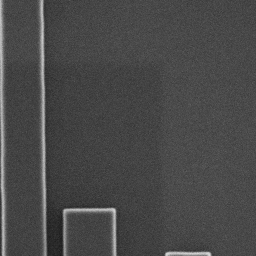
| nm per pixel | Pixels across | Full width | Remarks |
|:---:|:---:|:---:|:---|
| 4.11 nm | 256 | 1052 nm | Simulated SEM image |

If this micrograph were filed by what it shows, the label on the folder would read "groups of lines, slits or small figures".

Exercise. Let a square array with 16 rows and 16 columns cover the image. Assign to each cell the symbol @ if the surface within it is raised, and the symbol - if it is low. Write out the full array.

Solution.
@@@-------------
@@@-------------
@@@-------------
@@@-------------
@@@-------------
@@@-------------
@@@-------------
@@@-------------
@@@-------------
@@@-------------
@@@-------------
@@@-------------
@@@-------------
@@@-@@@---------
@@@-@@@---------
@@@-@@@---------